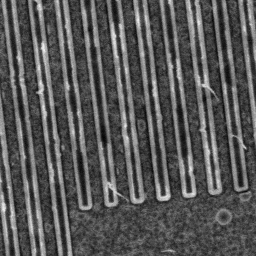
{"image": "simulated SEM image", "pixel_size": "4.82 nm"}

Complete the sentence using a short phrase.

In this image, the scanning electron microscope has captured parallel lines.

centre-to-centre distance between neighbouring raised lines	126	nm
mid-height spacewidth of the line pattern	77.2	nm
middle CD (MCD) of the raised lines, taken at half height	50.2	nm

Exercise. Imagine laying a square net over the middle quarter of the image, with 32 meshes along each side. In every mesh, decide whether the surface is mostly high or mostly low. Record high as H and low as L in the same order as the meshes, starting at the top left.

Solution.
HHHLLLHHHLLLLHHHLLLLHHLLLLHHHLLL
HHHLLLLHHLLLLHHHLLLLHHLLLLHHHLLL
HHHLLLLHHLLLLHHHLLLLHHLLLLLHHLLL
HHHLLLLHHLLLLHHHLLLLHHHLLLLHHLLL
HHHLLLLHHLLLLLHHLLLLHHHLLLLHHLLL
HHHLLLLHHHLLLLHHLLLLHHHLLLLHHLLL
LHHLLLLHHHLLLLHHLLLLHHHLLLLHHHLL
LHHLLLLHHHLLLLHHLLLLLHHLLLLHHHLL
LHHLLLLHHHLLLLHHHLLLLHHLLLLHHHLL
LHHHLLLLHHLLLLHHHLLLLHHLLLLHHHLL
LHHHLLLLHHLLLLHHHLLLLHHLLLLLHHLL
LHHHLLLLHHLLLLHHHLLLLHHHLLLLHHLL
LHHHLLLLHHLLLLLHHLLLLHHHLLLLHHLL
LHHHLLLLHHLLLLLHHLLLLHHHLLLLHHLL
LLHHLLLLHHHLLLLHHLLLLHHHLLLLHHLL
LLHHLLLLHHHLLLLHHLLLLLHHLLLLHHHL
LLHHLLLLHHHLLLLHHLLLLLHHLLLLHHHL
LLHHHLLLLHHLLLLHHHLLLLHHLLLLHHHL
LLHHHLLLLHHLLLLHHHLLLLHHLLLLHHHL
LLHHHLLLLHHLLLLHHHLLLLHHLLLLHHHL
LLHHHLLLLHHLLLLHHHLLLLHHHLLLLHHL
LLHHHLLLLHHLLLLLHHLLLLHHHLLLLHHL
LLHHHLLLLHHHLLLLHHLLLLHHHLLLLHHL
LLLHHLLLLHHHLLLLHHLLLLHHHLLLLHHH
LLLHHLLLLHHHLLLLHHLLLLLHHLLLLHHH
LLLHHHLLLLHHLLLLHHHLLLLHHLLLLHHH
LLLHHHLLLLHHLLLLHHHLLLLHHLLLLHHH
LLLHHHLLLLHHLLLLHHHLLLLHHLLLLHHH
LLLHHHLLLLHHLLLLHHHLLLLHHHLLLHHH
LLLHHHLLLLHHLLLLLHHLLLLHHHLLLLHH
LLLLHHLLLLHHHLLLLHHLLLLHHHLLLLHH
LLLLHHLLLLHHHLLLLHHLLLLHHHLLLLHH